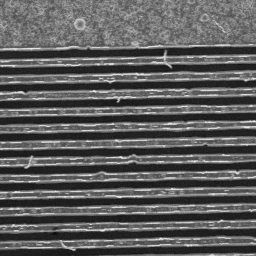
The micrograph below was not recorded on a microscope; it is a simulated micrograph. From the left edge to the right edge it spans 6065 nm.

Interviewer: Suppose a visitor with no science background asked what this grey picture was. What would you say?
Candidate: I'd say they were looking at parallel lines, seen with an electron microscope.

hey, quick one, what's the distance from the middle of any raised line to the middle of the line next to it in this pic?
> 392 nm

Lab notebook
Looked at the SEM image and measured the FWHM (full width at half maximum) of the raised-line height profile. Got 0.186 µm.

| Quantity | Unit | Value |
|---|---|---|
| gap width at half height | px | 8.75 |